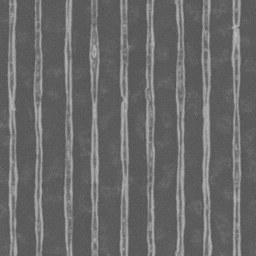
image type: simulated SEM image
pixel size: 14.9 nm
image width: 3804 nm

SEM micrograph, parallel lines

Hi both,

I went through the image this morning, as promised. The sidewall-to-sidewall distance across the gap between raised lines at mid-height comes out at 332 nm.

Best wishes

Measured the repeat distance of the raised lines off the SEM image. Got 416 nm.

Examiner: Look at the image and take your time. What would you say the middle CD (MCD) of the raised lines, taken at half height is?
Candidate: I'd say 0.0761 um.